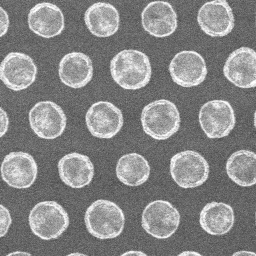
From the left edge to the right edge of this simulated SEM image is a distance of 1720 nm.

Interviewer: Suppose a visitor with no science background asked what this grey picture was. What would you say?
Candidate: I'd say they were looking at a regular array of raised bodies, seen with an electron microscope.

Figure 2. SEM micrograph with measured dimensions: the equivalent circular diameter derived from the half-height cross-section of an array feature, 240 nanometers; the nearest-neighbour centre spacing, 0.377 µm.